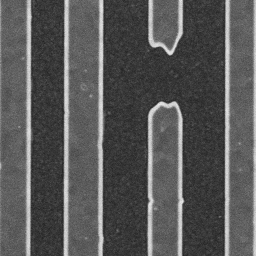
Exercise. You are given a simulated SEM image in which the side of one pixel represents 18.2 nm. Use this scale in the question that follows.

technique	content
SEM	one or a few lines or trenches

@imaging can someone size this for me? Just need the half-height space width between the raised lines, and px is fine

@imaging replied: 45.9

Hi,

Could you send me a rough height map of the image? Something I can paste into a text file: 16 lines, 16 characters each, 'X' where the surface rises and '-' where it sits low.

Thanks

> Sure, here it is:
XX--XX---XX---XX
XX--XX---XX---XX
XX--XX---XX---XX
XX--XX--------XX
XX--XX--------XX
XX--XX--------XX
XX--XX----X---XX
XX--XX---XX---XX
XX--XX---XX---XX
XX--XX---XX---XX
XX--XX---XX---XX
XX--XX---XX---XX
XX--XX---XX---XX
XX--XX---XX---XX
XX--XX---XX---XX
XX--XX---XX---XX